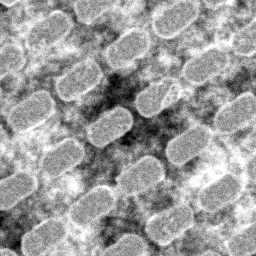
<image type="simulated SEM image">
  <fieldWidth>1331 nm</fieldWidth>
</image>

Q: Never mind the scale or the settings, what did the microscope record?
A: a regular array of raised bodies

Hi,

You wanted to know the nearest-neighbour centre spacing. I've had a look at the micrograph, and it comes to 293 nm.